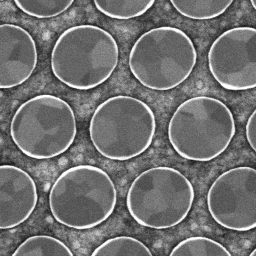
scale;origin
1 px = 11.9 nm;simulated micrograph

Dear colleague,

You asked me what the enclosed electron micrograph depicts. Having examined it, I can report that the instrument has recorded raised bodies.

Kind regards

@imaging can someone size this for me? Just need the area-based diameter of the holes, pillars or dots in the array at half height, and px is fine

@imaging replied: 63.2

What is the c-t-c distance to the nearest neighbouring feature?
929 nm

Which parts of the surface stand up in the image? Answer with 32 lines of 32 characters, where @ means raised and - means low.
--@@@@@@@---@@@@@@@---@@@@@@@---
---@@@@@-----@@@@@----@@@@@@----
--------------------------------
@@@------@@@--------@---------@-
@@@@----@@@@@@----@@@@@-----@@@@
@@@@---@@@@@@@---@@@@@@@---@@@@@
@@@@@--@@@@@@@@--@@@@@@@--@@@@@@
@@@@@--@@@@@@@@-@@@@@@@@--@@@@@@
@@@@---@@@@@@@--@@@@@@@@--@@@@@@
@@@@---@@@@@@@---@@@@@@----@@@@@
@@------@@@@------@@@@------@@@@
--------------------------------
----@@@@------@@@-------@@@-----
---@@@@@@---@@@@@@----@@@@@@----
--@@@@@@@---@@@@@@@---@@@@@@@--@
--@@@@@@@--@@@@@@@@--@@@@@@@@--@
--@@@@@@@--@@@@@@@@--@@@@@@@@--@
--@@@@@@@---@@@@@@@--@@@@@@@@--@
---@@@@@----@@@@@@----@@@@@@----
----@@@------@@@@------@@@@-----
--------------------------------
@@@-----@@@@@-----@@@@------@@@@
@@@@---@@@@@@@---@@@@@@----@@@@@
@@@@---@@@@@@@--@@@@@@@@--@@@@@@
@@@@@-@@@@@@@@--@@@@@@@@--@@@@@@
@@@@--@@@@@@@@--@@@@@@@@--@@@@@@
@@@@---@@@@@@@--@@@@@@@---@@@@@@
@@@----@@@@@@----@@@@@@----@@@@@
@----------------------------@@-
--------------------------------
---@@@@@-----@@@@@-----@@@@-----
--@@@@@@@---@@@@@@@---@@@@@@----